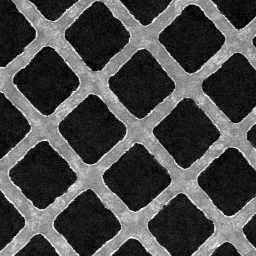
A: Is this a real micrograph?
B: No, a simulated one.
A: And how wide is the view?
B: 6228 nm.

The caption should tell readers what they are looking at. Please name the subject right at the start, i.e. a regular array of holes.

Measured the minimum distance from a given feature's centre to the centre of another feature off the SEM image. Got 1610 nanometers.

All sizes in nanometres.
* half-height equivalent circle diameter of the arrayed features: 1460